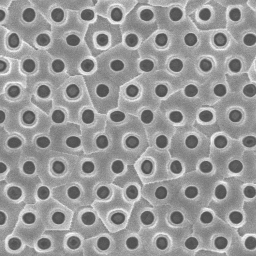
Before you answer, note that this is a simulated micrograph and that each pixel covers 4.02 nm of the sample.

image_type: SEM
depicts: a regular array of holes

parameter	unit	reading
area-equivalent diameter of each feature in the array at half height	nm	53.3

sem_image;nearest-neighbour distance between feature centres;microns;0.116